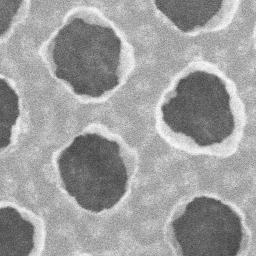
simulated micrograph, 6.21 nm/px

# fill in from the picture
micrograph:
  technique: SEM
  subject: holes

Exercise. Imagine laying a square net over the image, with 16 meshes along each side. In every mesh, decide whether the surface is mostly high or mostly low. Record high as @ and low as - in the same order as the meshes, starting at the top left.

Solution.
--@@@@@@@@----@@
-@@@---@@@@---@@
@@@----@@@@@@@@@
@@@-----@@@@@@@@
@@@-----@@@@-@@@
-@@@---@@@@---@@
-@@@@@@@@@----@@
-@@@@@@@@@-----@
-@@@@-@@@@@---@@
@@@@----@@@@@@@@
@@@@----@@@@@@@@
@@@@----@@@@@@@@
@@@@@--@@@@@--@@
--@@@@@@@@@----@
--@@@@@@@@@----@
--@@@@@@@@@----@